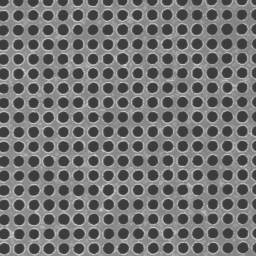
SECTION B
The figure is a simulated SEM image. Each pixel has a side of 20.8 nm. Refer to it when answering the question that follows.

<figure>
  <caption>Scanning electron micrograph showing a regular array of holes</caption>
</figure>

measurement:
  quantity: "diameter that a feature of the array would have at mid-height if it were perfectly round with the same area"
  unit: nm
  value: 226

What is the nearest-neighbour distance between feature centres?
0.301 um